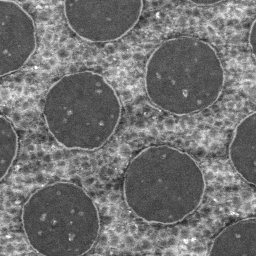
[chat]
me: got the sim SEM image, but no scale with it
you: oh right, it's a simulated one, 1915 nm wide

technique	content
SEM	raised bodies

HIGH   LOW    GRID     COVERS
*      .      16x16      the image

*...*****.......
**..****........
**...**....*....
**.......*****..
*....*...*****..
...****..*****..
...****...***...
...****........*
*..****........*
*........**...**
*.......****...*
...**...*****...
..****..*****...
.*****...***....
..****........**
..****.......***